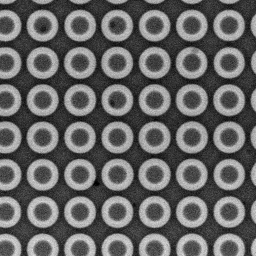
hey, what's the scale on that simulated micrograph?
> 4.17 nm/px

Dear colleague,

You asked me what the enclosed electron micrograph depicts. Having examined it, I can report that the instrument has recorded an array of small figures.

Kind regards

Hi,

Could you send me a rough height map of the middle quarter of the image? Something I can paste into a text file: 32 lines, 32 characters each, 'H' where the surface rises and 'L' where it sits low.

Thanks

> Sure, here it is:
HHHHHHHHLHHHHHHHHLLHHHHHHHLLHHHH
LHHHHHHHLLHHHHHHHLLHHHHHHHLLHHHH
LHHHHHHLLLHHHHHHLLLLHHHHHLLLLHHH
LLLHHLLLLLLLHHLLLLLLLLHLLLLLLLLH
LLLLLLLLLLLLLLLLLLLLLLLLLLLLLLLL
LLHHHHLLLLLLHHHLLLLLLHHHLLLLLLHH
LHHHHHHLLLHHHHHHLLLLHHHHHHLLLHHH
HHHHHHHHLLHHHHHHHLLHHHHHHHLLHHHH
HHHHHHHHLLHHHHHHHLLHHHHHHHLLHHHH
HHHHHHHHLLHHHHHHHLLHHHHHHHLLHHHH
HHHHHHHHLLHHHHHHHLLHHHHHHHLLHHHH
LHHHHHHLLLHHHHHHLLLLHHHHHHLLLHHH
LLHHHHLLLLLLHHHLLLLLLHHHLLLLLLHH
LLLLLLLLLLLLLLLLLLLLLLLLLLLLLLLL
LLLLLLLLLLLLLLLLLLLLLLLLLLLLLLLH
LHHHHHHLLLLHHHHHLLLLHHHHHLLLLHHH
LHHHHHHLLLHHHHHHHLLHHHHHHHLLLHHH
HHHHHHHHLLHHHHHHHLLHHHHHHHLLHHHH
HHHHHHHHLLHHHHHHHLLHHHHHHHLLHHHH
HHHHHHHHLLHHHHHHHLLHHHHHHHLLHHHH
LHHHHHHLLLHHHHHHHLLHHHHHHHLLLHHH
LLHHHHLLLLLHHHHHLLLLHHHHHLLLLLHH
LLLLLLLLLLLLLLLLLLLLLLLLLLLLLLLL
LLLLLLLLLLLLLLLLLLLLLLLLLLLLLLLL
LLHHHHLLLLLHHHHHLLLLHHHHHLLLLLHH
LHHHHHHLLLHHHHHHHLLHHHHHHHLLLHHH
HHHHHHHHLLHHHHHHHLLHHHHHHHLLHHHH
HHHHHHHHLLHHHHHHHLLHHHHHHHLLHHHH
HHHHHHHHLLHHHHHHHLLHHHHHHHLLHHHH
LHHHHHHLLLHHHHHHHLLHHHHHHHLLHHHH
LHHHHHHLLLLHHHHHLLLLHHHHHLLLLHHH
LLLLLLLLLLLLHHHLLLLLLHHHLLLLLLLH